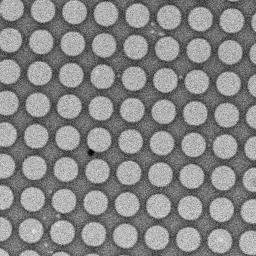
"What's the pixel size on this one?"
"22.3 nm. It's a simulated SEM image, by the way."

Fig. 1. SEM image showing an array of small figures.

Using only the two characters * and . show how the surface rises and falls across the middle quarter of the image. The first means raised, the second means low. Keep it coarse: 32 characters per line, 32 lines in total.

****....***.....................
****...*****....****....***.....
*****..*****...*****...*****...*
*****..*****...*****..******...*
****...*****...*****..******..**
.**.....***....*****...*****...*
.................*......***....*
................................
***.....***.....................
****...*****...****....****.....
****..******..******..******...*
****..******..******..******..**
****...*****..******..******..**
.......****....****...*****...**
........................**.....*
................................
***....***......*...............
****..*****...*****....***.....*
****..******..******..*****...**
****..******..*****...*****...**
***...*****...*****...*****..***
.......***.....****...*****...**
.......................***.....*
*...............................
***....***.....**...............
***...*****...*****...****.....*
***...*****..******..******..***
***...*****..******..******..***
***...*****..******..******..***
.......***....****....****...***
.......................**.....**
*...............................